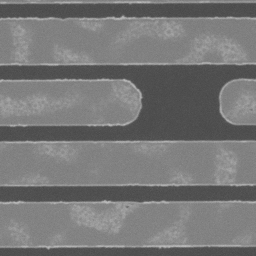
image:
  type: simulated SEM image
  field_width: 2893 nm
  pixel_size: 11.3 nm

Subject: parallel lines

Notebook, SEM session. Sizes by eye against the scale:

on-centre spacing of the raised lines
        690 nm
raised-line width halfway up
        514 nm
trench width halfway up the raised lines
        15.5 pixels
